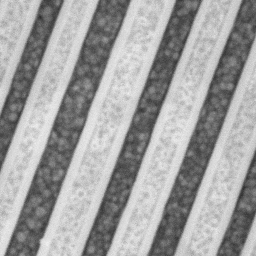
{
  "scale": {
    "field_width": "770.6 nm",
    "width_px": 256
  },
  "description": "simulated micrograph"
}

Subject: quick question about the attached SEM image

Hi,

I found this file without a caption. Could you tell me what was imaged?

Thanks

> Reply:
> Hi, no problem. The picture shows one or a few lines or trenches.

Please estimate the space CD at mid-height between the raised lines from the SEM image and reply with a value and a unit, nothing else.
102 nm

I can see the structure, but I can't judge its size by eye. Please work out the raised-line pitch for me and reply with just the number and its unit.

195 nanometres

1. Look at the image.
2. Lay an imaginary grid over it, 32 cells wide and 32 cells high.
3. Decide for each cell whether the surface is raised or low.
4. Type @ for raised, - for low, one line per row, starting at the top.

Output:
@@@@----@@@@-----@@@@-----@@@---
@@@@----@@@-----@@@@@----@@@@---
@@@@----@@@-----@@@@-----@@@@---
@@@----@@@------@@@@----@@@@----
@@@----@@@-----@@@@@----@@@@----
@@@----@@@-----@@@@-----@@@@----
@@----@@@------@@@@----@@@@-----
@@----@@@-----@@@@@----@@@@----@
@----@@@@-----@@@@-----@@@-----@
@----@@@-----@@@@@----@@@@-----@
@----@@@-----@@@@@----@@@@----@@
----@@@------@@@@----@@@@-----@@
----@@@-----@@@@@----@@@@-----@@
----@@@-----@@@@-----@@@@----@@@
---@@@------@@@@----@@@@-----@@@
---@@@-----@@@@@----@@@@----@@@@
--@@@@-----@@@@-----@@@-----@@@@
--@@@------@@@@----@@@@-----@@@@
--@@@-----@@@@@----@@@@----@@@@-
-@@@@-----@@@@-----@@@-----@@@@-
-@@@-----@@@@@----@@@@-----@@@@-
-@@@-----@@@@-----@@@@----@@@@--
@@@------@@@@----@@@@-----@@@@--
@@@-----@@@@@----@@@@----@@@@@--
@@@-----@@@@-----@@@@----@@@@---
@@------@@@@----@@@@-----@@@@---
@@-----@@@@@----@@@@----@@@@@---
@@-----@@@@-----@@@-----@@@@----
@------@@@@----@@@@-----@@@@----
@-----@@@@@----@@@@----@@@@-----
------@@@@----@@@@-----@@@@----@
-----@@@@@----@@@@-----@@@@----@